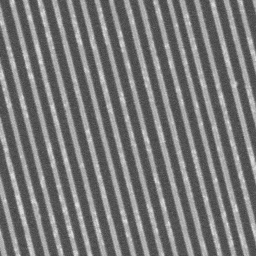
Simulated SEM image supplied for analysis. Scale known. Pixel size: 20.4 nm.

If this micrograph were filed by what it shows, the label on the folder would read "parallel lines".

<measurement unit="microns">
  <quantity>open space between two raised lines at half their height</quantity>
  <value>0.2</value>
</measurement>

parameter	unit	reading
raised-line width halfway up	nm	79.2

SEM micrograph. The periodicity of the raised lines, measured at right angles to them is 283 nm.